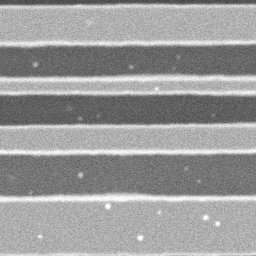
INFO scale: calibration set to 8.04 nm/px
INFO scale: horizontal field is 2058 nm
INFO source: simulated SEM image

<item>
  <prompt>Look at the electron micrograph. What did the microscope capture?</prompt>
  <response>lines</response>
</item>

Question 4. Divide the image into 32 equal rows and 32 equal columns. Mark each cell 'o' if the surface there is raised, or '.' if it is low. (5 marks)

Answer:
................................
oooooooooooooooooooooooooooooooo
oooooooooooooooooooooooooooooooo
oooooooooooooooooooooooooooooooo
oooooooooooooooooooooooooooooooo
.ooo............................
................................
................................
................................
................................
oooooooooooooooooooooooooooooooo
oooooooooooooooooooooooooooooooo
................................
................................
................................
................................
oooooooooooooooooooooooooooooooo
oooooooooooooooooooooooooooooooo
oooooooooooooooooooooooooooooooo
................................
................................
................................
................................
................................
................................
oooooooooooooooooooooooooooooooo
oooooooooooooooooooooooooooooooo
oooooooooooooooooooooooooooooooo
oooooooooooooooooooooooooooooooo
oooooooooooooooooooooooooooooooo
oooooooooooooooooooooooooooooooo
oooooooooooooooooooooooooooooooo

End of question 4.